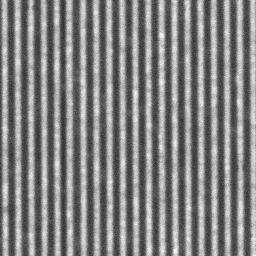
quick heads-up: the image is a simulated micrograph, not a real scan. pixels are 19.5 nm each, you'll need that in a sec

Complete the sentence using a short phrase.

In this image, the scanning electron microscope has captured parallel lines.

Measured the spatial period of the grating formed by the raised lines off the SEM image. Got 255 nm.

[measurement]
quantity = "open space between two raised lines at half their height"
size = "161 nm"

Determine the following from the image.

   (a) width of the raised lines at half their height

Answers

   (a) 0.0903 um